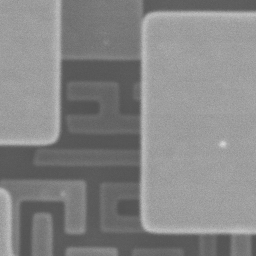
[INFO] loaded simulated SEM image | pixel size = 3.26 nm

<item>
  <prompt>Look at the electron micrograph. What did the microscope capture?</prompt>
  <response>wiring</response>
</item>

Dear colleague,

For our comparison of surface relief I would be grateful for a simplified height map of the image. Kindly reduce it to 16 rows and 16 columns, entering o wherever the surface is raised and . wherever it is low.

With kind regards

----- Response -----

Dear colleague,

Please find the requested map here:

oooo............
oooo.....ooooooo
oooo.....ooooooo
oooo.....ooooooo
oooo.....ooooooo
oooo.....ooooooo
oooo.....ooooooo
oooo.....ooooooo
oooo.....ooooooo
.........ooooooo
.........ooooooo
.........ooooooo
o........ooooooo
o........ooooooo
o........ooooooo
o...............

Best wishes